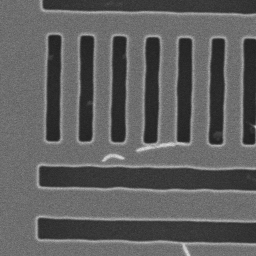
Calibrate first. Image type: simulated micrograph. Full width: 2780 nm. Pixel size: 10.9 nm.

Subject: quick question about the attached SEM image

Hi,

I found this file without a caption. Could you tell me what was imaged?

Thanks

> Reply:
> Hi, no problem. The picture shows groups of lines, slits or small figures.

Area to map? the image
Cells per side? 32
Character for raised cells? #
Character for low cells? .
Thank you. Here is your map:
#####...........................
###########.###..##.............
################################
################################
######.#########################
######..##..##..##..##..##..##..
######..##..##..##..##..##..##..
######..##..##..##..##..##..##..
######..##..##..##..##..##..##..
######..##..##..##..##..##..##..
######..##..##..##..##..##..##..
######..##..##..##..##..##..##..
######..##..##..##..##..##..##..
######..##..##..##..##..##..##..
######..##..##..##..##..##..##..
######.###..##..##..##..##..##..
######.###..##..##..##..##..##..
######.###.###.###..##..##..##..
################################
################################
################################
#####...........................
#####...........................
##########....##................
################################
################################
################################
#####........###################
#####...........................
#####...........................
###############################.
################################